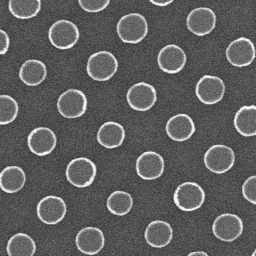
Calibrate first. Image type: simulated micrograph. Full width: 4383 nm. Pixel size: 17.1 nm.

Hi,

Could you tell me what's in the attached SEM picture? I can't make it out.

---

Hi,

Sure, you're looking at a regular array of raised bodies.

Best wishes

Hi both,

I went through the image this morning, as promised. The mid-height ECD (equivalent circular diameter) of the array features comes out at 479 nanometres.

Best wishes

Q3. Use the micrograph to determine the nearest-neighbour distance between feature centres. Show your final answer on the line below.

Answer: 823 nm